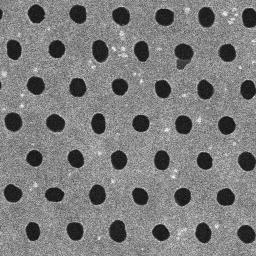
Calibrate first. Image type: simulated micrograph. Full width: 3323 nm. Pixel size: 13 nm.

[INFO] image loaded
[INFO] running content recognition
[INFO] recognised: a regular array of holes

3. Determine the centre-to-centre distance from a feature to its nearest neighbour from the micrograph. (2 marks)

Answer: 536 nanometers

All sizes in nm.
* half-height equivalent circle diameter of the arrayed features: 229